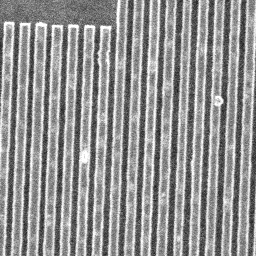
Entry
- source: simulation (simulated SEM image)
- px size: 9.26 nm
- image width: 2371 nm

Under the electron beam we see parallel lines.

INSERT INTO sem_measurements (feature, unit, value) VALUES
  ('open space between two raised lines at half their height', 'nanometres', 67.1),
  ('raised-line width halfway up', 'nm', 84.4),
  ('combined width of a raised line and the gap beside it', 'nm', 149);